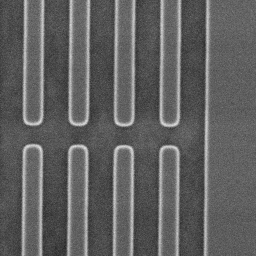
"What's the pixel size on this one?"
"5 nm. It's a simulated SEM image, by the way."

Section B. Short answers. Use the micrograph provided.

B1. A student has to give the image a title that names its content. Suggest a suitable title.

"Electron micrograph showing groups of lines, slits or small figures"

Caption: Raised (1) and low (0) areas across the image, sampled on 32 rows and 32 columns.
00011000011000111000110000111111
00011000011000111000110000111111
00011000011000111000110000111111
00011000011000111000110000111111
00011000011000111000110000111111
00011000011000111000110000111111
00011000011000111000110000111111
00011000011000111000110000111111
00011000011000111000110000111111
00011000011000111000110000111111
00011000011000111000110000111111
00011000011000111000110000111111
00011000011000111000110000111111
00011000011000111000110000111111
00011000011000111000110000111111
00001000010000010000110000111111
00000000000000000000000000111111
00000000000000000000000000111111
00011000011000010000110000111111
00011000011000111000110000111111
00011000011000111000110000111111
00011000011000111000110000111111
00011000011000111000110000111111
00011000011000111000110000111111
00011000011000111000110000111111
00011000011000111000110000111111
00011000011000111000110000111111
00011000011000111000110000111111
00011000111000111000110000111111
00011000111000111000110000111111
00011000111000110000110000111111
00011000111000110000110000111111